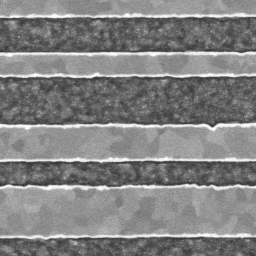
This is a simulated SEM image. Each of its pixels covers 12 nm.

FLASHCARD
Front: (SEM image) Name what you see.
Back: one or a few lines or trenches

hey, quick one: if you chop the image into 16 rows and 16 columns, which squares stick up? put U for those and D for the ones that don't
UUUUUUUUUUUUUUUU
DDDDDDDDDDDDDDDD
DDDDDDDDDDDDDDDD
UUUUUUUUUUUUUUUU
UUUUUUUUUUUUUUUU
DDDDDDDDDDDDDDDD
DDDDDDDDDDDDDDDD
DDDDDDDDDDDDDDDD
UUUUUUUUUUUUUUUU
UUUUUUUUUUUUUUUU
DDDDDDDDDDDDDDDD
DDDDDDDDDDDDDDDD
UUUUUUUUUUUUUUUU
UUUUUUUUUUUUUUUU
UUUUUUUUUUUUUUUU
DDDDDDDDDDDDDDDD